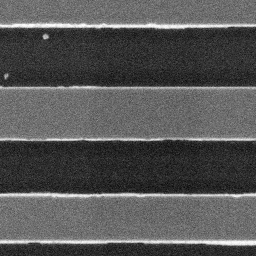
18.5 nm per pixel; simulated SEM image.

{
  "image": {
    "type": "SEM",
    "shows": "lines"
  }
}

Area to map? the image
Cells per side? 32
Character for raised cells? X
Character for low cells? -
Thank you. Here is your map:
XXXXXXXXXXXXXXXXXXXXXXXXXXXXXXXX
XXXXXXXXXXXXXXXXXXXXXXXXXXXXXXXX
XXXXXXXXXXXXXXXXXXXXXXXXXXXXXXXX
--------------------------------
--------------------------------
--------------------------------
--------------------------------
--------------------------------
--------------------------------
--------------------------------
--------------------------------
XXXXXXXXXXXXXXXXXXXXXXXXXXXXXXXX
XXXXXXXXXXXXXXXXXXXXXXXXXXXXXXXX
XXXXXXXXXXXXXXXXXXXXXXXXXXXXXXXX
XXXXXXXXXXXXXXXXXXXXXXXXXXXXXXXX
XXXXXXXXXXXXXXXXXXXXXXXXXXXXXXXX
XXXXXXXXXXXXXXXXXXXXXXXXXXXXXXXX
--------------------------------
--------------------------------
--------------------------------
--------------------------------
--------------------------------
--------------------------------
--------------------------------
XXXXXXXXXXXXXXXXXXXXXXXXXXXXXXXX
XXXXXXXXXXXXXXXXXXXXXXXXXXXXXXXX
XXXXXXXXXXXXXXXXXXXXXXXXXXXXXXXX
XXXXXXXXXXXXXXXXXXXXXXXXXXXXXXXX
XXXXXXXXXXXXXXXXXXXXXXXXXXXXXXXX
XXXXXXXXXXXXXXXXXXXXXXXXXXXXXXXX
--------------------------------
--------------------------------